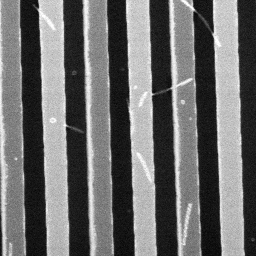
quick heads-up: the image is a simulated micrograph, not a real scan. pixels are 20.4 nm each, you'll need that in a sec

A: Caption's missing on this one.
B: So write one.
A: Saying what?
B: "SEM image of lines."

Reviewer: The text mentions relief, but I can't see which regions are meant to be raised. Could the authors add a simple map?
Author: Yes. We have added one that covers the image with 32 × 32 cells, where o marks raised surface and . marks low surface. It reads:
oo...ooo..ooo...ooo..ooo...ooo..
oo...ooo..ooo...ooo..ooo...ooo..
oo...ooo..ooo...ooo..ooo...ooo..
ooo..ooo...oo...ooo..ooo...ooo..
ooo..ooo...oo...ooo..ooo...ooo..
ooo..ooo...oo...ooo..ooo...ooo..
ooo..ooo...ooo..ooo..ooo...ooo..
ooo..ooo...ooo..ooo..ooo...ooo..
ooo..ooo...ooo..ooo..ooo...ooo..
ooo..ooo...ooo..ooo..ooo...ooo..
ooo..ooo...ooo..ooo...oo...ooo..
ooo..ooo...ooo..ooo..ooo...ooo..
ooo..ooo...ooo..ooo...oo...ooo..
ooo..ooo...ooo..ooo...oo...ooo..
ooo..ooo...ooo..ooo...oo...ooo..
ooo..ooo...ooo..ooo...ooo..ooo..
ooo..ooo...ooo..ooo...ooo..ooo..
ooo..ooo...ooo..ooo...ooo..ooo..
ooo..ooo...ooo..ooo...ooo..ooo..
ooo...oo...ooo..ooo...ooo..ooo..
ooo...oo...ooo..ooo...ooo..ooo..
ooo...oo...ooo...oo...ooo..ooo..
ooo...oo...ooo...oo...ooo..ooo..
ooo...oo...ooo...oo...ooo..ooo..
ooo...oo...ooo...oo...ooo..ooo..
ooo...oo...ooo...oo...ooo...oo..
ooo...oo...ooo...oo...ooo...oo..
ooo...ooo..ooo...oo...ooo...oo..
ooo...ooo..ooo...oo...ooo...oo..
ooo...ooo..ooo...oo...ooo...oo..
ooo...ooo..ooo...ooo..ooo...oo..
ooo...ooo..ooo...ooo..ooo...ooo.